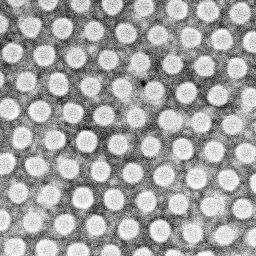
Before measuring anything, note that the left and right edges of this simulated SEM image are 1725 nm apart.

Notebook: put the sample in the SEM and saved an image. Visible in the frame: an array of small figures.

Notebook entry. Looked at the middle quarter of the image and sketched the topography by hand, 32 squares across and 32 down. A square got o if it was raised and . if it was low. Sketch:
..oo.....oooo....oooo....oooo...
..................oo.....oooo...
................................
......oo........................
o....oooo....ooo................
o...ooooo...ooooo....oooo....ooo
o...ooooo...ooooo...ooooo...oooo
.....ooo.....ooo....ooooo...oooo
.....................ooo.....ooo
..............................o.
.oo.............................
oooo....oooo.....oo.............
oooo....oooo....oooo....oooo....
oooo....oooo....oooo....oooo....
.oo......ooo....oooo....oooo....
.................oo.....oooo....
................................
....ooo.........................
....oooo....ooo......o..........
...ooooo...ooooo....oooo....ooo.
....oooo...ooooo...ooooo....oooo
.....oo.....ooo....ooooo...ooooo
....................ooo.....oooo
................................
ooo.....oo......................
ooo....oooo.....ooo.............
ooo....oooo....oooo....oooo.....
ooo....oooo....oooo....oooo....o
........ooo....oooo....oooo....o
................oo......ooo....o
................................
...ooo..........................